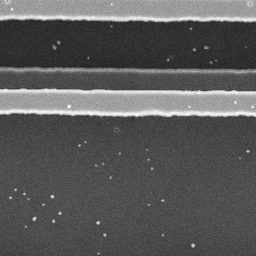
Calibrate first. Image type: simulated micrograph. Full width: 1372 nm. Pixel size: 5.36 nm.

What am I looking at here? lines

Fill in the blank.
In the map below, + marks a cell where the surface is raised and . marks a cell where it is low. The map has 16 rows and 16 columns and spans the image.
++++++++++++++++
................
................
................
++++++++++++++++
++++++++++++++++
++++++++++++++++
................
................
................
................
................
................
................
................
................